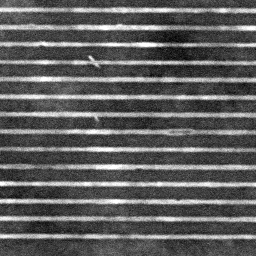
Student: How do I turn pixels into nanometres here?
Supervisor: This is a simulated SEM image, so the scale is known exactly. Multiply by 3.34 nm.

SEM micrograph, parallel lines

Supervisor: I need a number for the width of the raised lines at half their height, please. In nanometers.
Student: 10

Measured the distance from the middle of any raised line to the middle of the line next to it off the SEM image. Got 58.2 nanometers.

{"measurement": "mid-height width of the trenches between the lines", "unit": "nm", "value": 46.4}